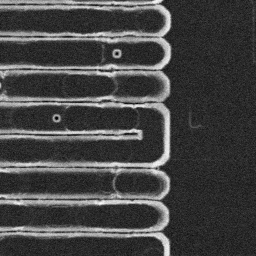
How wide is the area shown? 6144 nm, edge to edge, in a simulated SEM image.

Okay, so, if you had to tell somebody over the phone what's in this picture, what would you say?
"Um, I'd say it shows wiring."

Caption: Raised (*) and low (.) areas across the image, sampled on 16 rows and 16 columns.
**********......
**********......
**********......
**********......
**********......
**********......
**********......
**********......
**********......
**********......
**********......
**********......
**********......
**********......
**********......
**********......